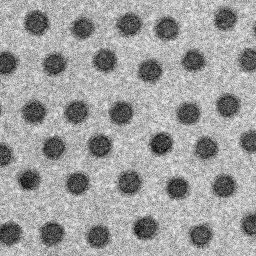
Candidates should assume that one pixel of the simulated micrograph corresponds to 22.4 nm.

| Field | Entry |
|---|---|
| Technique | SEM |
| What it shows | a regular array of raised bodies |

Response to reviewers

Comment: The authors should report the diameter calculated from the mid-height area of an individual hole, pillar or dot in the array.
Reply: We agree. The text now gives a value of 480 nm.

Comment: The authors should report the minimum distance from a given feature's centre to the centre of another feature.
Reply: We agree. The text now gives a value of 41.3 px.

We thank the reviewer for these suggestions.